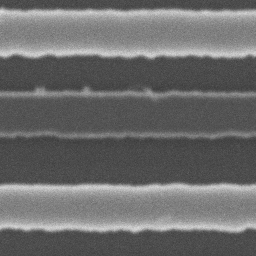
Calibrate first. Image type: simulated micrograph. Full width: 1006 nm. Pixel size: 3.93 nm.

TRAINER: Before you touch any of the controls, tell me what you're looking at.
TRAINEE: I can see lines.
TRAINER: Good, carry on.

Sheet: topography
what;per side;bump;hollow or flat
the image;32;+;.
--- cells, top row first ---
................................
+++++++++++++++.++++++++.+++++++
++++++++++++++++++++++++++++++++
++++++++++++++++++++++++++++++++
++++++++++++++++++++++++++++++++
++++++++++++++++++++++++++++++++
++++++++++++++++++++++++++++++++
................................
................................
................................
................................
........+.......+.+..++.........
++++++++++++++++++++++++++++++++
++++++++++++++++++++++++++++++++
++++++++++++++++++++++++++++++++
++++++++++++++++++++++++++++++++
++++++++++++++++++++++++++++++++
................................
................................
................................
................................
................................
................................
++++++++++++++++++++++++++++++++
++++++++++++++++++++++++++++++++
++++++++++++++++++++++++++++++++
++++++++++++++++++++++++++++++++
++++++++++++++++++++++++++++++++
+.+++++++++++++++++++++++++++++.
................................
................................
................................